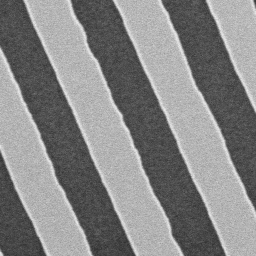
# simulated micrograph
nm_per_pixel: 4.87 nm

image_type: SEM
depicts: lines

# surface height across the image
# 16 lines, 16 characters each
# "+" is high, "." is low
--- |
..+++..+++...+++
..+++...+++...++
...++...+++...++
...+++...+++..++
+..+++...+++...+
+...+++...++...+
++..+++...+++...
++...+++..+++...
+++..+++...+++..
+++...+++..+++..
+++...+++...+++.
.+++..+++...+++.
.+++...+++...+++
..+++..+++...+++
..+++...+++...++
...+++..+++...++